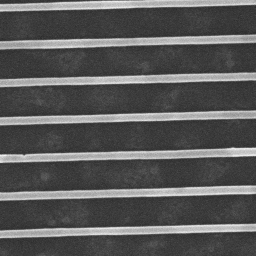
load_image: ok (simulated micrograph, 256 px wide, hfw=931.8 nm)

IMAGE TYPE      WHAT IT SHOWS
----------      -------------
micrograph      parallel lines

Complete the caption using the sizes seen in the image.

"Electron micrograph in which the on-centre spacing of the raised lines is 0.137 µm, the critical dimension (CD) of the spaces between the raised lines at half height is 111 nanometres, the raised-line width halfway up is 0.025 micrometres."